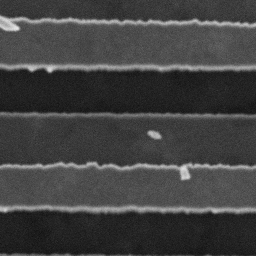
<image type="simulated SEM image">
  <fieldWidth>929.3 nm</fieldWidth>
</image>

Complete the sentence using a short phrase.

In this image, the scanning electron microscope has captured lines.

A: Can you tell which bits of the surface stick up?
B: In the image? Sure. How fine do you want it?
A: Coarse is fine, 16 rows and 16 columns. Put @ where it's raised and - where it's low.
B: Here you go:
@@@@@@@@@@@@@@@@
@@@@@@@@@@@@@@@@
@@@@@@@@@@@@@@@@
@@@@@@@@@@@@@@@@
----------------
----------------
----------------
@@@@@@@@@@@@@@@@
@@@@@@@@@@@@@@@@
@@@@@@@@@@@@@@@@
@@@@@@@@@@@@@@@@
@@@@@@@@@@@@@@@@
@@@@@@@@@@@@@@@@
----------------
----------------
----------------